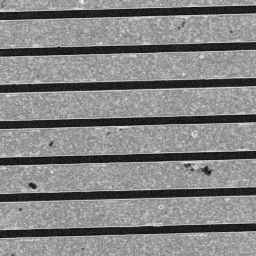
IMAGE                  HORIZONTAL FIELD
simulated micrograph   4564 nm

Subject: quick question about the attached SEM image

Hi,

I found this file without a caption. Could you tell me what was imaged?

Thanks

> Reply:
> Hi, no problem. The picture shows parallel lines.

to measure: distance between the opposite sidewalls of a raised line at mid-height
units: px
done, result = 27.6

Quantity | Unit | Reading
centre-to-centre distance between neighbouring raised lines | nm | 642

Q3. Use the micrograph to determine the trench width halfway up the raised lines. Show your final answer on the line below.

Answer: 145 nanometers